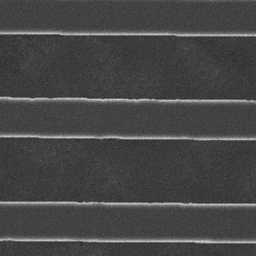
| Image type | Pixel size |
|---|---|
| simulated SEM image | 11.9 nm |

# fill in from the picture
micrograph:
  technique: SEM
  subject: lines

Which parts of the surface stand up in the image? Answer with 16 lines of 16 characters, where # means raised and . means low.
################
################
................
................
................
................
################
################
################
................
................
................
................
################
################
................